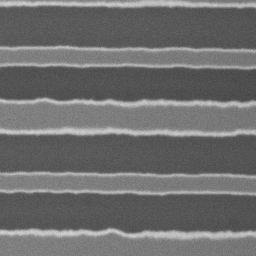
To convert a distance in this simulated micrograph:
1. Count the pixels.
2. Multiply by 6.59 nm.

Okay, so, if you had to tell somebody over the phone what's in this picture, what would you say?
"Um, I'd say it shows lines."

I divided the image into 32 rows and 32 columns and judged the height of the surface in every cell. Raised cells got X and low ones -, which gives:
XXXXXXXXXXXXXXXXXXXXXXXXXXXXXXXX
--------------------------------
--------------------------------
--------------------------------
--------------------------------
--------------------------------
XXXXXXXXXXXXXXXXXXXXXXXXXXXXXXXX
XXXXXXXXXXXXXXXXXXXXXXXXXXXXXXXX
------------------------------XX
--------------------------------
--------------------------------
--------------------------------
X---XXX--X----------------------
XXXXXXXXXXXXXXXXXXXXXXXXXXXXXXXX
XXXXXXXXXXXXXXXXXXXXXXXXXXXXXXXX
XXXXXXXXXXXXXXXXXXXXXXXXXXXXXXXX
XXXXXXXXXXXXXXXXXXXXXXXXXXXXXXXX
--------------------------------
--------------------------------
--------------------------------
--------------------------------
--------------------------------
XXXXXXXXXXXXXXXXXXXXXXXXXXXXXXXX
XXXXXXXXXXXXXXXXXXXXXXXXXXXXXXXX
--------------------------------
--------------------------------
--------------------------------
--------------------------------
--------------------------------
XXXXXXXXXXXXXXXXXXXXXXXXXXXXXXXX
XXXXXXXXXXXXXXXXXXXXXXXXXXXXXXXX
XXXXXXXXXXXXXXXXXXXXXXXXXXXXXXXX